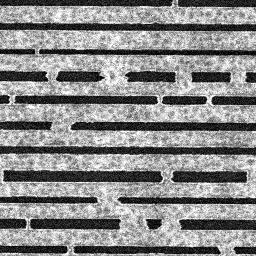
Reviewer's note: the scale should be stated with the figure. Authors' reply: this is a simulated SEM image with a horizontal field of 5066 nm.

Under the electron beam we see parallel lines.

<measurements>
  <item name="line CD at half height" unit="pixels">15.5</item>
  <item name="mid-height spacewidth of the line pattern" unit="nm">173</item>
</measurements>